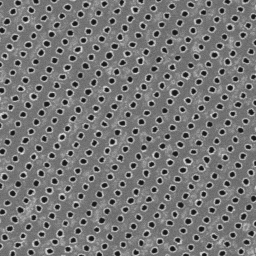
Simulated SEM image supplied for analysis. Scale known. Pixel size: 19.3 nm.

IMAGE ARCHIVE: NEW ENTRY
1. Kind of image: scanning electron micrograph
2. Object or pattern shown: a regular array of holes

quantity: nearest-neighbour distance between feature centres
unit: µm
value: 0.199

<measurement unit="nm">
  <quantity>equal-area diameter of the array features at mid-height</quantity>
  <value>104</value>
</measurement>